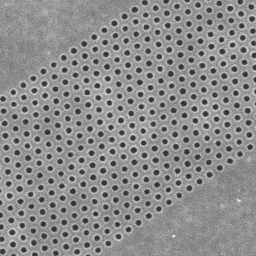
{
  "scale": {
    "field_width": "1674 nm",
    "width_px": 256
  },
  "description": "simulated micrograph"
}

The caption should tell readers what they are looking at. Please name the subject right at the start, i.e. a regular array of holes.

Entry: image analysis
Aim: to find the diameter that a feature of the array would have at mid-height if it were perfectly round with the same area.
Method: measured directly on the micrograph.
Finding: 5.64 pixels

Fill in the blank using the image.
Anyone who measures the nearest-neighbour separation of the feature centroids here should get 78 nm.